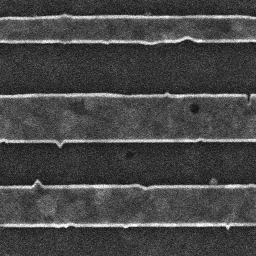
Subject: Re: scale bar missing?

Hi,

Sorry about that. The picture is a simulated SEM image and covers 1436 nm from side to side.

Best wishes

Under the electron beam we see one or a few lines or trenches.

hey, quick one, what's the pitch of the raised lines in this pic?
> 495 nm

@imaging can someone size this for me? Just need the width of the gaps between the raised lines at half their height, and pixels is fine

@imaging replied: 49.1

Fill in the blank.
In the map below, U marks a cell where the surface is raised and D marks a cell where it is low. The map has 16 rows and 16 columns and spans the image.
DDDDDDDDDDDDDDDD
UUUUUUUUUUUUUUUU
UUUUUUUUUUUDUUUU
DDDDDDDDDDDDDDDD
DDDDDDDDDDDDDDDD
DDDDDDDDDDDDDDDD
UUUUUUUUUUUUUUUU
UUUUUUUUUUUUUUUU
UUUUUUUUUUUUUUUU
DDDDDDDDDDDDDDDD
DDDDDDDDDDDDDDDD
DDDDDDDDDDDDDDDD
UUUUUUUUUUUUUUUU
UUUUUUUUUUUUUUUU
DDDDDDDDDDDDDDDD
DDDDDDDDDDDDDDDD